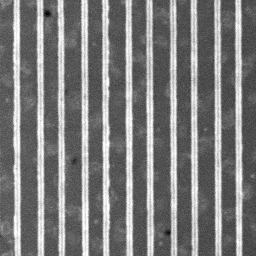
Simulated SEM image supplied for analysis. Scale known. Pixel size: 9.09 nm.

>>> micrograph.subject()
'parallel lines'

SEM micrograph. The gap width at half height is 161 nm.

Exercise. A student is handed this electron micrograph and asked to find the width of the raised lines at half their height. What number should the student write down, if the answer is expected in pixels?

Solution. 4.13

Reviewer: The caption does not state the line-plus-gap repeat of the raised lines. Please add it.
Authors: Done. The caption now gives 202 nm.